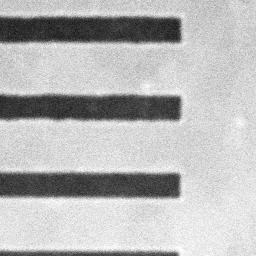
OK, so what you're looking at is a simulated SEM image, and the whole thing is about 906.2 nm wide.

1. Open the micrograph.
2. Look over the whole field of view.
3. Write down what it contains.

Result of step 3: one or a few lines or trenches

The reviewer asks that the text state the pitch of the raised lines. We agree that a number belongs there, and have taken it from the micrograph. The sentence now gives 275 nm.